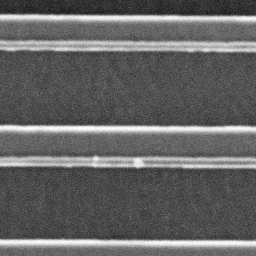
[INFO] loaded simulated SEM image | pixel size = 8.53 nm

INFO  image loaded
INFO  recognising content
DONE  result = lines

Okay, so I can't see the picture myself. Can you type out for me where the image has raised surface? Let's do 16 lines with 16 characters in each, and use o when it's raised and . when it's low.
................
oooooooooooooooo
oooooooooooooooo
................
................
................
................
................
oooooooooooooooo
oooooooooooooooo
................
................
................
................
................
oooooooooooooooo